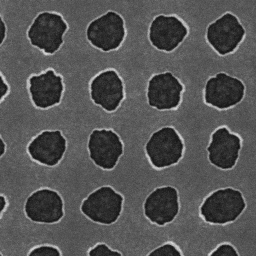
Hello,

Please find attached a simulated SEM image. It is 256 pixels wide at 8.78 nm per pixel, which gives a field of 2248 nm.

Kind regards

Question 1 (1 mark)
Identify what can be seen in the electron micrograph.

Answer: a regular array of holes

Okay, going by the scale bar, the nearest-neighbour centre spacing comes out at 502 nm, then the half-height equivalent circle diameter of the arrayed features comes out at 36.7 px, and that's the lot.